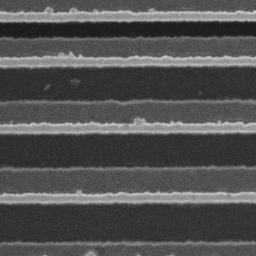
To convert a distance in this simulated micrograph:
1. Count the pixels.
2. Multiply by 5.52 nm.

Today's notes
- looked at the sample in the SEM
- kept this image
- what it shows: lines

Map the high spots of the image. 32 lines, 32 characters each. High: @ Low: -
@@@@@@@@@@@@@@@@@@@@@@@@@@@@@@@@
@@@@@@@@@@@@@@@@@@@@@@@@@@@@@@@@
@@@@@@@@@@@@@@@@@@@@@@@@@@@@@@@@
--------------------------------
--------------------------------
@@@@@@@@@@@@@@@@@@@@@@@@@@@@@@@@
@@@@@@@@@@@@@@@@@@@@@@@@@@@@@@@@
@@@@@@@@@@@@@@@@@@@@@@@@@@@@@@@@
--------------------------------
--------------------------------
--------------------------------
--------------------------------
--------------------------------
@@@@@@@@@@@@@@@@@@@@@@@@@@@@@@@@
@@@@@@@@@@@@@@@@@@@@@@@@@@@@@@@@
@@@@@@@@@@@@@@@@@@@@@@@@@@@@@@@@
@@@@@@@@@@@@@@@@@@@@@@@@@@@@@@@@
--------------------------------
--------------------------------
--------------------------------
--------------------------------
@@@@@@@@@@@@@@@@@@@@@@@@@@@@@@@@
@@@@@@@@@@@@@@@@@@@@@@@@@@@@@@@@
@@@@@@@@@@@@@@@@@@@@@@@@@@@@@@@@
@@@@@@@@@@@@@@@@@@@@@@@@@@@@@@@@
--------------------------------
--------------------------------
--------------------------------
--------------------------------
--------------------------------
@@@@@@@@@@@@@@@@@@@@@@@@@@@@@@@@
@@@@@@@@@@@@@@@@@@@@@@@@@@@@@@@@